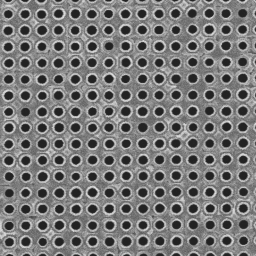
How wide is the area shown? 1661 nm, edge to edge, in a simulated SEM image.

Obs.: a regular array of holes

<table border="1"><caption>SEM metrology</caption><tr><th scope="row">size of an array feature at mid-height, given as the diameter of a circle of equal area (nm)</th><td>54.8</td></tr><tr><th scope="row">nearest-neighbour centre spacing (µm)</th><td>0.104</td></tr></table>